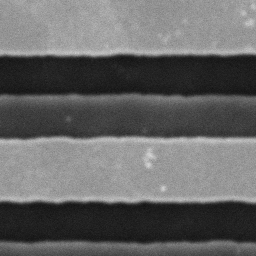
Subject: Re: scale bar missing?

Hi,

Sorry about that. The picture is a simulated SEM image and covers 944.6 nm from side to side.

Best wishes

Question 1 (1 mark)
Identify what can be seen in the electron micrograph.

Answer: lines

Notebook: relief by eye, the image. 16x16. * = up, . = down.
****************
****************
****************
................
................
................
****************
****************
****************
****************
****************
****************
****************
................
................
****************